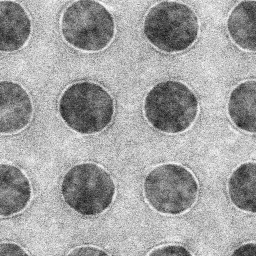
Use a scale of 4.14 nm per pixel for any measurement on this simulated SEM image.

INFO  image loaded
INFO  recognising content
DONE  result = raised bodies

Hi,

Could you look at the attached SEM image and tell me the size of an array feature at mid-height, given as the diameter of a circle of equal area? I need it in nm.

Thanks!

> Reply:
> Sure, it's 227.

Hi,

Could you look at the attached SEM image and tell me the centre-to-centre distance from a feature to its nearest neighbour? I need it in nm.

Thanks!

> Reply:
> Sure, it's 339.